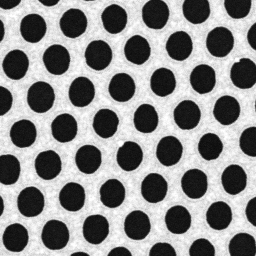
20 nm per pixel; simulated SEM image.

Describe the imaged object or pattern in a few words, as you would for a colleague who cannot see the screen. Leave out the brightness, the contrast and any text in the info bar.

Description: a regular array of holes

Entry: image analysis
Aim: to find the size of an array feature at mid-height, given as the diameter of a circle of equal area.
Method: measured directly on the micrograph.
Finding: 28.7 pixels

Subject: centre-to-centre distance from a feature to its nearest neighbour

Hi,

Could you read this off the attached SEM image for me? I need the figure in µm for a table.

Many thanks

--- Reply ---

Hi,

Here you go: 0.788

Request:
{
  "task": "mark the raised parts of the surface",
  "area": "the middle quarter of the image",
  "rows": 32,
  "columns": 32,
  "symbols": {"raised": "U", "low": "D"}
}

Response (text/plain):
DUUUUUDDDDDUUUUUUUUUUUUUUUUUUUUU
DUUUUUUUDDUUUUUUUUUUUUUDDDDUUUUU
UUUUUUUUUUUUUDDDUUUUUUDDDDDUUUUU
UUUDDDUUUUUUDDDDDUUUUUDDDDDDUUUD
UUDDDDDUUUUDDDDDDDUUUDDDDDDDUUUD
UDDDDDDDUUUDDDDDDDUUUUDDDDDDUUUU
UDDDDDDDUUUDDDDDDDUUUUDDDDDUUUUU
UDDDDDDDUUUDDDDDDDUUUUUDDDDUUUUU
UDDDDDDUUUUUDDDDDUUUUUUUUUUUUUUU
UUDDDDDUUUUUUUDUUUUUUUUUUUUUUDDD
UUDDDDUUUUUUUUUUUUUDDDUUUUUUDDDD
UUUUUUUUUDDDUUUUUUDDDDDUUUUDDDDD
DUUUUUUUDDDDDUUUUDDDDDDUUUUDDDDD
DDDUUUUDDDDDDDUUUDDDDDDDUUUDDDDD
DDDUUUUDDDDDDDUUUDDDDDDDUUUUDDDD
DDDUUUUDDDDDDDUUUUDDDDDDUUUUDDDD
DDDUUUUUDDDDDUUUUUDDDDDUUUUUUUDU
DDDUUUUUDDDDDUUUUUUUUUUUUUUUUUUU
DDDUUUUUUUDUUUUUUUUUUUUUDDDDUUUU
DUUUUUUUUUUUUUUDDDUUUUUUDDDDDUUU
UUUUDDDDUUUUUUDDDDDUUUUDDDDDDDUU
UUUDDDDDDUUUUDDDDDDDUUUDDDDDDDUU
UUUDDDDDDUUUUDDDDDDDUUUDDDDDDDUU
UUUDDDDDDUUUUDDDDDDDUUUDDDDDDUUU
UUUDDDDDDUUUUDDDDDDUUUUUDDDDDUUU
UUUDDDDDDUUUUUDDDDDUUUUUUDDUUUUU
UUUUDDDDUUUUUUUDDUUUUUUUUUUUUUUD
UUUUUDDUUUUUUUUUUUUUUDDDUUUUUUDD
UUUUUUUUUUUUUUUUUUUUDDDDDUUUUDDD
UDUUUUUUUUDDDDUUUUUDDDDDDDUUUDDD
DDDDUUUUUDDDDDDUUUUDDDDDDDUUUDDD
DDDDDUUUUDDDDDDUUUUDDDDDDDUUUUDD